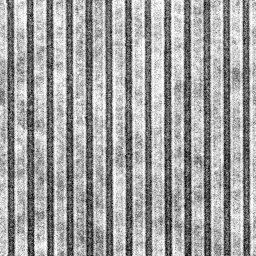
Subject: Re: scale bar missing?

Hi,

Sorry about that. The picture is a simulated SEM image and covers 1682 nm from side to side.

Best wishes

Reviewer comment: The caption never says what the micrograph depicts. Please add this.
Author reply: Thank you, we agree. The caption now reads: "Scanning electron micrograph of parallel lines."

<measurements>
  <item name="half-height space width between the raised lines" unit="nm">60.8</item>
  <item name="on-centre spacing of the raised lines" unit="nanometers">129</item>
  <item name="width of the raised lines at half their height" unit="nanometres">66.6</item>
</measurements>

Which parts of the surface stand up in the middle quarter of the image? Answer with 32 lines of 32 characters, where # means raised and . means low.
...##...##..###..###..###..###..
...##...##..###..###..###..###..
...##...##..###..###..###..###..
...##...##..###..###..###..###..
...##...##..###...##..###..###..
...##...##..###...##..###..###..
...##...##..###...##..###..###..
...##...##..###...##..###..###..
...##...##..###...##..###..###..
...##...##..###...##..###..###..
...##...##..###...##..###..###..
...##...##..###...##..###..###..
...##...##..###...##..###..###..
...##...##..###...##..###..###..
...##...##..###...##..###..###..
...##...##..###...##..###..###..
...##...##..###...##..###..###..
...##...##..###...##..###..###..
...##...##..###...##..###..###..
...##...##..###...##..###..###..
...##...##...##...##..###..###..
...##...##...##...##..###..###..
...##...##...##...##..###..###..
...##...##...##...##..###..###..
...##...##...##...##..###..###..
...##...##...##...##..###..###..
...##...##...##...##..###..###..
...##...##...##...##..###..###..
...##...##...##...##..###..###..
...##...##...##...##..###..###..
...##...##...##...##..###..###..
...##...##...##...##..###..###..